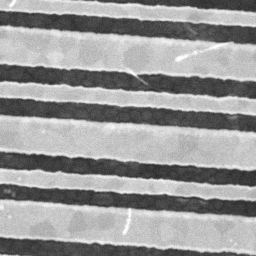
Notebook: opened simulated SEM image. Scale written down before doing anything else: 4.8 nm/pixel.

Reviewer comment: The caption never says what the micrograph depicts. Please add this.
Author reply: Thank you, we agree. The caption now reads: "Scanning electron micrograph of lines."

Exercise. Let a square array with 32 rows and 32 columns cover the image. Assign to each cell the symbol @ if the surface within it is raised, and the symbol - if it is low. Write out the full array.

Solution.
@@@@@@@@@@@@@@@-----------------
---@@@@@@@@@@@@@@@@@@@@@@@@@@@@-
------------------@@@@@@@@@@@@@@
@@@-----------------------------
@@@@@@@@@@@@@@@@----------------
@@@@@@@@@@@@@@@@@@@@@@@@@@@@@@--
@@@@@@@@@@@@@@@@@@@@@@@@@@@@@@@@
@@@@@@@@@@@@@@@@@@@@@@@@@@@@@@@@
-------@@@@@@@@@@@@@@@@@@@@@@@@@
---------------------@@@@@@@@@@@
@@@@@---------------------------
@@@@@@@@@@@@@@@@@@@-------------
-----@@@@@@@@@@@@@@@@@@@@@@@@@@@
--------------------@@@@@@@@@@@@
--------------------------------
@@@@@@@@@@@@@@@@@---------------
@@@@@@@@@@@@@@@@@@@@@@@@@@@@@@--
@@@@@@@@@@@@@@@@@@@@@@@@@@@@@@@@
@@@@@@@@@@@@@@@@@@@@@@@@@@@@@@@@
--------@@@@@@@@@@@@@@@@@@@@@@@@
--------------------@@@@@@@@@@@@
@@@@@@--------------------------
@@@@@@@@@@@@@@@@@@@@@-----------
-------@@@@@@@@@@@@@@@@@@@@@@@@@
-----------------------@@@@@@@@@
@@@@@@@@------------------------
@@@@@@@@@@@@@@@@@@@@@@----------
@@@@@@@@@@@@@@@@@@@@@@@@@@@@@@@@
@@@@@@@@@@@@@@@@@@@@@@@@@@@@@@@@
@@@@@@@@@@@@@@@@@@@@@@@@@@@@@@@@
--------------@@@@@@@@@@@@@@@@@@
--------------------------@@-@@@